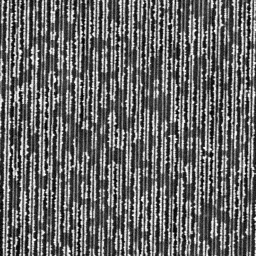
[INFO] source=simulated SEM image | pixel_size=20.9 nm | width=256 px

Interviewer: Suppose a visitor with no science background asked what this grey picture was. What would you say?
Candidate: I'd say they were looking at parallel lines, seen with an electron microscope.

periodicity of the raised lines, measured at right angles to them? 182 nanometres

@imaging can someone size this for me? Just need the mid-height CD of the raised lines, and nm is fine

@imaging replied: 94.1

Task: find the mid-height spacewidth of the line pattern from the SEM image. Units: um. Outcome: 0.0915